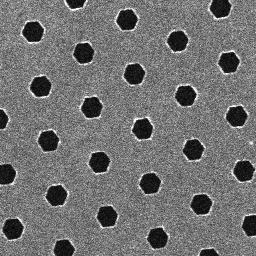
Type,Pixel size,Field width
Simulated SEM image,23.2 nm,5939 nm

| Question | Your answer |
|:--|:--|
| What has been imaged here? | a regular array of holes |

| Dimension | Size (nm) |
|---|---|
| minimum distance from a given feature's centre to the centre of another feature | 1260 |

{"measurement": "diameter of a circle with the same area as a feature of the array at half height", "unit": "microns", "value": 0.49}